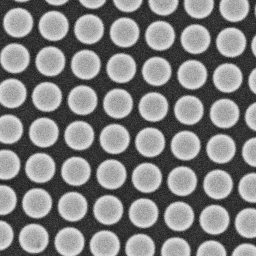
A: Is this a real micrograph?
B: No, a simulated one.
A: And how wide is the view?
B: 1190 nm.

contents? an array of small figures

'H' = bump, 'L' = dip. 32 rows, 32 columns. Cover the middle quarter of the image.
LLHHHHHHHLLHHHHHHHLLHHHHHHLLLHHH
LLHHHHHHHLLHHHHHHHLLHHHHHHHLLHHH
LLLHHHHHLLLHHHHHHHLLHHHHHHHLLHHH
LLLLHHHLLLLLHHHHHLLLHHHHHHLLLHHH
LLLLLLLLLLLLLLHLLLLLLHHHHHLLLHHH
LLLLLLLLLLLLLLLLLLLLLLLLLLLLLLHH
LLHHHHHLLLLLHHLLLLLLLLLLLLLLLLLL
LHHHHHHHLLLHHHHHLLLLLHHHLLLLLLLL
LHHHHHHHLLHHHHHHHLLLHHHHHLLLLHHH
LHHHHHHHLLHHHHHHHLLHHHHHHHLLHHHH
LHHHHHHHLLHHHHHHHLLHHHHHHHLLHHHH
LLHHHHHLLLHHHHHHHLLHHHHHHHLLHHHH
LLLLHHLLLLLHHHHHLLLHHHHHHLLLHHHH
LLLLLLLLLLLLLLLLLLLLHHHHHLLLHHHH
LLLHLLLLLLLLLLLLLLLLLLLLLLLLLHHH
LHHHHHLLLLLHHHLLLLLLLLLLLLLLLLLL
LHHHHHHLLLHHHHHLLLLLHHHLLLLLLLLL
HHHHHHHLLHHHHHHHLLLHHHHHLLLLHHHH
HHHHHHHLLHHHHHHHLLHHHHHHHLLHHHHH
LHHHHHHLLHHHHHHHLLHHHHHHHLLHHHHH
LHHHHHLLLLHHHHHHLLHHHHHHHLLHHHHH
LLLLLLLLLLHHHHHLLLLHHHHHLLLHHHHH
LLLLLLLLLLLLLLLLLLLHHHHHLLLLHHHH
LLHHLLLLLLLLLLLLLLLLLLLLLLLLLHHH
HHHHHHLLLLHHHHLLLLLLLLLLLLLLLLLL
HHHHHHLLLHHHHHHLLLLHHHHLLLLLLLLL
HHHHHHLLHHHHHHHLLLHHHHHHLLLHHHHH
HHHHHHLLHHHHHHHLLHHHHHHHLLHHHHHH
HHHHHHLLHHHHHHHLLHHHHHHHLLHHHHHH
LHHHHLLLLHHHHHHLLHHHHHHHLLHHHHHH
LLLLLLLLLLHHHHLLLLHHHHHHLLHHHHHH
LLLLLLLLLLLLLLLLLLLHHHHLLLLHHHHH